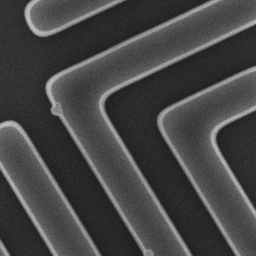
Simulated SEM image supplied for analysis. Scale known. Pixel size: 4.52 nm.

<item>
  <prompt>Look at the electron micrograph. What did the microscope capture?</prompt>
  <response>groups of lines, slits or small figures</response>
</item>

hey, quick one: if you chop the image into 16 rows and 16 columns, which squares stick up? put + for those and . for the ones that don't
..+++++.....++++
..++......++++++
........++++++..
......++++++....
....+++++......+
...++++......+++
...+++.....+++++
....+++...++++..
++...++...+++...
++...+++...+++..
+++...+++...++..
.++...+++...+++.
.+++...+++...++.
..+++...++...+++
...++...+++...++
...+++...+++...+